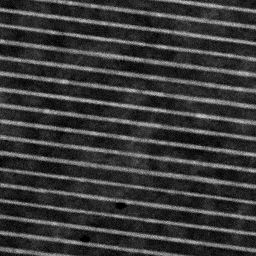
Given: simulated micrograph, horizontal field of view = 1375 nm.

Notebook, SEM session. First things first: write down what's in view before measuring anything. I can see parallel lines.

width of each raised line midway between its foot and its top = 14.6 nanometres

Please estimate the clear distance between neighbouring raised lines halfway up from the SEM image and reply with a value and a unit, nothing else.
69.8 nm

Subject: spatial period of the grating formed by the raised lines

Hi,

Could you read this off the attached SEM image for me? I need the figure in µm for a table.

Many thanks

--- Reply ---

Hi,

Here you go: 0.0847